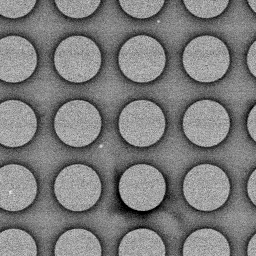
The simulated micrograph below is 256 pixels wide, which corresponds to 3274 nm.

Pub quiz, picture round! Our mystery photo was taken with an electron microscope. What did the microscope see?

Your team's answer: an array of small figures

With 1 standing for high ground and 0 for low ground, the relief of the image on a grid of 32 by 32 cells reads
11110001111100011111000111110001
11110000111100001111000011110000
00000000000000000000000000000000
00000000000000000000000000000000
00000000000000000100000000000000
11110000111100001111000011110000
11110001111100011111000111111001
11111001111110011111100111111001
11110001111100011111000111110001
11110000111100001111000011110000
00000000000000000000000000000000
00000000000000000000000000000000
00000000000000000000000000000000
11110000111100001111000011110000
11110001111100011111000111111001
11111001111110011111100111111001
11110001111100011111000111110001
11110000111100001111000011110000
00000000000000000000000000000000
00000000000000000000000000000000
00000000000000000000000000000000
11110000111100001111000011110000
11110001111100011111000111111001
11111001111110011111100111111001
11110001111100011111000111110001
11110000111100001111000011110000
00000000000000000000000000000000
00000000000000000000000000000000
00000000000000000000000000000000
11110000111100001111000011110000
11110001111100011111000111110001
11110001111110011111100111111001